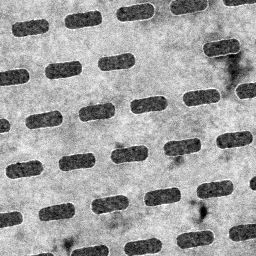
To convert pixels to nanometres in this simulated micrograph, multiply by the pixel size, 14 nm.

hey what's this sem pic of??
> a regular array of raised bodies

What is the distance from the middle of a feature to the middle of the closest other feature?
0.742 microns